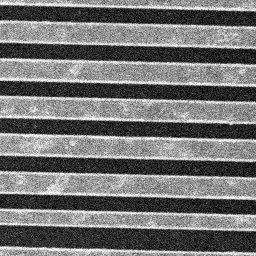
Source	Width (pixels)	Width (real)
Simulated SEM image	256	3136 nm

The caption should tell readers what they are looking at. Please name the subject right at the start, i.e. parallel lines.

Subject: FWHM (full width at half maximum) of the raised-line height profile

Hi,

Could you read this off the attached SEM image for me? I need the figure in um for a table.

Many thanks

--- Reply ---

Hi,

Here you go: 0.251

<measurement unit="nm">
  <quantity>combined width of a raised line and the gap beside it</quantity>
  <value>454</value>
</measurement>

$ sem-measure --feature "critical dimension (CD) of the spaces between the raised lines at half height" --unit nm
207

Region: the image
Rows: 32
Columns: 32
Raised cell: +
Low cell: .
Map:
.+++++++++++++++++++++++++++++++
................................
................................
++++++++++++++++++++++++++++++++
++++++++++++++++++++++++++++++++
..............++++++++++++++++++
................................
+++++...........................
++++++++++++++++++++++++++++++++
++++++++++++++++++++++++++++++++
.......................+++++++++
................................
+++++++++++++++.................
++++++++++++++++++++++++++++++++
++++++++++++++++++++++++++++++++
................................
................................
++++++++++++++++++++++++++++....
++++++++++++++++++++++++++++++++
..........++++++++++++++++++++++
................................
................................
++++++++++++++++++++++++++++++++
++++++++++++++++++++++++++++++++
...................+++++++++++++
................................
++++++++++......................
++++++++++++++++++++++++++++++++
...................+++++++++++++
................................
................................
+++++++++++++++++++..++.........